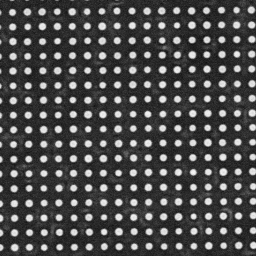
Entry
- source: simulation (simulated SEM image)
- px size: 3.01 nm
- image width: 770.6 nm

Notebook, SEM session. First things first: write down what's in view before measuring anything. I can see a regular array of raised bodies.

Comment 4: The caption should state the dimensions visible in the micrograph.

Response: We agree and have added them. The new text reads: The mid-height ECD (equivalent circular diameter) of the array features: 19.2 nm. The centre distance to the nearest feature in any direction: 43.2 nanometres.